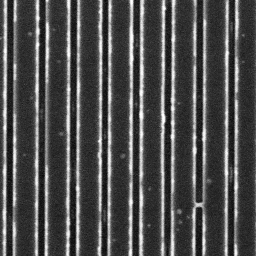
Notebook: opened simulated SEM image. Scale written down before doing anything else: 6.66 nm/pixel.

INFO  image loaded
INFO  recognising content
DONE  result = parallel lines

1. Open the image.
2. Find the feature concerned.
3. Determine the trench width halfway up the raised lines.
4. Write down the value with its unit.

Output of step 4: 0.0508 um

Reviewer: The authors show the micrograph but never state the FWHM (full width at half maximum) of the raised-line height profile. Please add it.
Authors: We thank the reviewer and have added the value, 158 nm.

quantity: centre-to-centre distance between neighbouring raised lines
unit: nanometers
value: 210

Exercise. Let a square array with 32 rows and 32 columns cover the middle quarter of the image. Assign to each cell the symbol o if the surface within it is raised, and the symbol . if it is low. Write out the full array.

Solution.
o..oooooo..oooooo..oooooo..ooooo
o..oooooo..oooooo..oooooo..ooooo
o..oooooo..oooooo..oooooo..ooooo
o..oooooo..oooooo..oooooo..ooooo
o..oooooo..oooooo..oooooo..ooooo
o..oooooo..oooooo..oooooo..ooooo
o..oooooo..oooooo..oooooo..ooooo
o..oooooo..oooooo..oooooo..ooooo
o..oooooo..oooooo..oooooo..ooooo
o..oooooo..oooooo..oooooo..ooooo
o..oooooo..oooooo..oooooo..ooooo
o..oooooo..oooooo..oooooo..ooooo
o..oooooo..oooooo..oooooo..ooooo
o..oooooo..oooooo..oooooo..ooooo
o..oooooo..oooooo..oooooo..ooooo
o..oooooo..oooooo..oooooo..ooooo
o..oooooo..oooooo..oooooo..ooooo
o..oooooo..oooooo..oooooo..ooooo
o..oooooo..oooooo..oooooo..ooooo
o..oooooo..oooooo..oooooo..ooooo
o..oooooo..oooooo..oooooo..ooooo
o..oooooo..oooooo..oooooo..ooooo
o..oooooo..oooooo..oooooo..ooooo
o..oooooo..oooooo..oooooo..ooooo
o..oooooo..oooooo..oooooo..ooooo
o..oooooo..oooooo..oooooo..ooooo
o..oooooo..oooooo..oooooo..ooooo
o..oooooo..oooooo..oooooo..ooooo
o..oooooo..oooooo..oooooo..ooooo
o..oooooo..oooooo..oooooo..ooooo
o..oooooo..oooooo..oooooo..ooooo
o..oooooo..oooooo..oooooo..ooooo